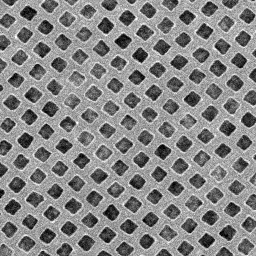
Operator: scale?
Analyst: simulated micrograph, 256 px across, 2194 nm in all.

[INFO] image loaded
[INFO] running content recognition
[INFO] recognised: a regular array of holes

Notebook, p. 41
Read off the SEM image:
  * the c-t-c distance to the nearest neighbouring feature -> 191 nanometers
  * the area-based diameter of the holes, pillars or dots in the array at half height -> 127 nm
